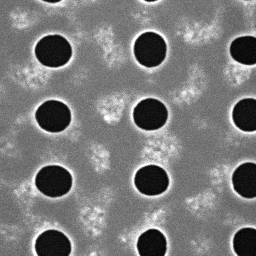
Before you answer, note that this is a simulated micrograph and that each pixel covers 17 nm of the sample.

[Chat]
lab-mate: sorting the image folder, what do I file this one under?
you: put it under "holes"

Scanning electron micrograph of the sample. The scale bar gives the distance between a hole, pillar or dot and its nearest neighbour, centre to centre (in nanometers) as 1100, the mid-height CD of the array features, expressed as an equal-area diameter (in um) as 0.594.